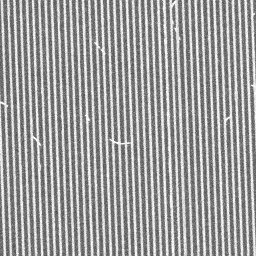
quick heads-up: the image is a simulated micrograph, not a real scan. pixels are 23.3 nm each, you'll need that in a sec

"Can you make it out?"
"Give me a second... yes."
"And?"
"parallel lines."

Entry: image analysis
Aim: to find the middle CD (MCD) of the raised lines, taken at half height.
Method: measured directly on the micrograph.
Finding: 1.87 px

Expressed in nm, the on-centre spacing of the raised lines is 145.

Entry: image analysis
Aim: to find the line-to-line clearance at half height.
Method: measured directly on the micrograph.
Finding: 4.5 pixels